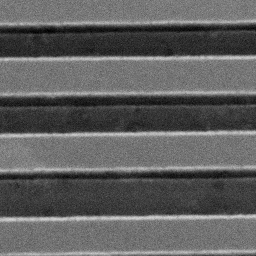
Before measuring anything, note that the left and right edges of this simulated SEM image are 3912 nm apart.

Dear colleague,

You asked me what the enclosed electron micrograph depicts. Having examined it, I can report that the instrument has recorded lines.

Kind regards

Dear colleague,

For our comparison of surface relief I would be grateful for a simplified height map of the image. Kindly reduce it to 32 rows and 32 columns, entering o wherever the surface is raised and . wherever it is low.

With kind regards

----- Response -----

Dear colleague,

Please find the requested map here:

oooooooooooooooooooooooooooooooo
oooooooooooooooooooooooooooooooo
oooooooooooooooooooooooooooooooo
................................
................................
................................
................................
oooooooooooooooooooooooooooooooo
oooooooooooooooooooooooooooooooo
oooooooooooooooooooooooooooooooo
oooooooooooooooooooooooooooooooo
oooooooooooooooooooooooooooooooo
................................
................................
................................
................................
............................oooo
oooooooooooooooooooooooooooooooo
oooooooooooooooooooooooooooooooo
oooooooooooooooooooooooooooooooo
oooooooooooooooooooooooooooooooo
................................
................................
................................
................................
................................
................................
oooooooooooooooooooooooooooooooo
oooooooooooooooooooooooooooooooo
oooooooooooooooooooooooooooooooo
oooooooooooooooooooooooooooooooo
ooooooooooooooooooooooooooooo...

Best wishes